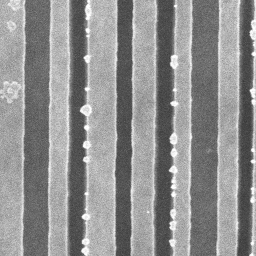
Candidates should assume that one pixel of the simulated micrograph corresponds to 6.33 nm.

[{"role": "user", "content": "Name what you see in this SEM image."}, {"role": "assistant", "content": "lines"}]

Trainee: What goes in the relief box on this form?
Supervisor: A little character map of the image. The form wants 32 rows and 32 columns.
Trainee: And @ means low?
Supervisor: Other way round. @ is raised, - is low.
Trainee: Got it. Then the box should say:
@@@---@@@--@@@@--@@@--@@---@@@--
@@@---@@@--@@@@--@@@--@@---@@@--
@@@---@@@--@@@@--@@@--@@---@@@--
@@@---@@@--@@@@--@@---@@---@@@-@
@@@---@@@--@@@@--@@---@@---@@@-@
@@@---@@@--@@@@--@@@--@@---@@@--
@@@---@@@--@@@@--@@@--@@---@@@--
@@@---@@@--@@@@--@@--@@@---@@@--
@@@---@@@--@@@---@@---@@---@@@--
@@@---@@@--@@@---@@---@@---@@@--
@@@---@@@--@@@---@@---@@---@@@--
@@@---@@@--@@@@--@@---@@---@@@-@
@@@---@@---@@@@--@@---@@---@@@--
@@@---@@@-@@@@---@@---@@---@@@--
@@@---@@@--@@@---@@---@@---@@@--
@@@---@@@--@@@---@@---@@---@@@--
@@@---@@@--@@@@--@@---@@---@@@--
@@@---@@@--@@@@--@@--@@@---@@@--
@@@---@@@--@@@---@@---@@---@@@--
@@@---@@---@@@---@@---@@---@@@--
@@@---@@---@@@---@@---@@---@@@--
@@@---@@---@@@---@@--@@@---@@@--
@@@---@@---@@@---@@---@@---@@@--
@@@---@@---@@@--@@@---@@---@@@--
@@@---@@---@@@--@@@---@@---@@@-@
@@@---@@---@@@--@@@---@@---@@@--
@@@---@@---@@@--@@@--@@@---@@@--
@@@---@@---@@@--@@@--@@@---@@@--
@@@---@@---@@@---@@--@@@---@@@--
@@@---@@---@@@--@@@---@@---@@@--
@@@---@@--@@@@--@@@--@@@---@@@-@
@@@---@@--@@@@--@@@---@@---@@--@